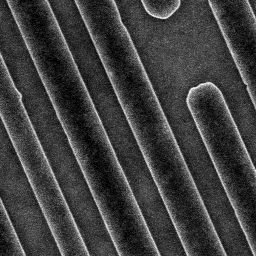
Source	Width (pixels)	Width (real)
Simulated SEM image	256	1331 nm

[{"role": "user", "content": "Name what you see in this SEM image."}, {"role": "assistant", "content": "one or a few lines or trenches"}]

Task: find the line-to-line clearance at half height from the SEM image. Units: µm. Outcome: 0.131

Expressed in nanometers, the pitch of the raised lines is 316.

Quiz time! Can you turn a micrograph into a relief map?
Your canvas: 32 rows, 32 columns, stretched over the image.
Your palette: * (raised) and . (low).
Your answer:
.*****....****....****....*****.
.******...*****...****.....*****
..*****...*****............*****
..*****....*****............****
...*****...*****............****
...*****....*****...........****
....*****...*****............***
....*****....*****...........***
*....*****...*****............**
*....*****....****............**
**...******...*****......**....*
**....*****...*****.....****...*
***...*****....*****...*****...*
***....*****...*****....****....
***....*****....*****...*****...
.***....*****...*****...*****...
.***....*****....****....*****..
.****....*****...*****...*****..
..***....*****....****....*****.
..****...******...*****...*****.
...***....*****...*****....*****
...****...*****....*****...*****
....***....*****...*****....****
....***....*****....*****...****
....****....*****...*****...****
.....***....*****....****....***
*....****....*****...*****...***
*.....***....*****...*****....**
**....****...*****....*****...**
**.....***....*****...*****....*
***....****...*****....*****...*
***.....***....*****...*****....